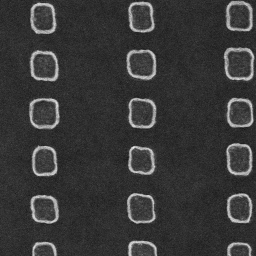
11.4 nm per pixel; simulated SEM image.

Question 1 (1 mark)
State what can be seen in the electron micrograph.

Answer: a regular array of raised bodies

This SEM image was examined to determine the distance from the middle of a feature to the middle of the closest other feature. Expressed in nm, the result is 543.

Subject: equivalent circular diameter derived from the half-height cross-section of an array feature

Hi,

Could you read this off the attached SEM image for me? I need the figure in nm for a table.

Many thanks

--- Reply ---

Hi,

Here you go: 313